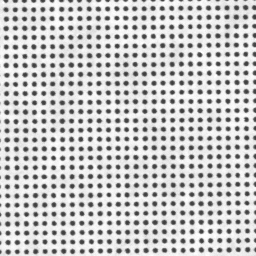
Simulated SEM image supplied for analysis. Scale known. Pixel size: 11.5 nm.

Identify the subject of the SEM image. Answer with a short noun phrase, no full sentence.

a regular array of holes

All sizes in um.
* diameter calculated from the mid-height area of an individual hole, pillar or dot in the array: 0.0662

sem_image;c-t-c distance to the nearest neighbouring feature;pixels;8.91